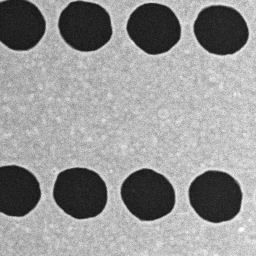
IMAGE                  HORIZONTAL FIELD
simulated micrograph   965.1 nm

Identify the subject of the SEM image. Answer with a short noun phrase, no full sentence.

holes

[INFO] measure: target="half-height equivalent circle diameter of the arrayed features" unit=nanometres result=198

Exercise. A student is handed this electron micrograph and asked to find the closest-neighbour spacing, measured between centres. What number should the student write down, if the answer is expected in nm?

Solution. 255